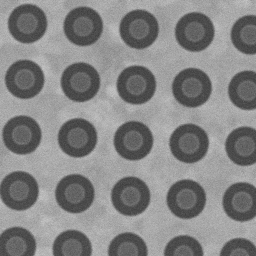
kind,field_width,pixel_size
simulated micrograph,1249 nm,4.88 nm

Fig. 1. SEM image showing an array of small figures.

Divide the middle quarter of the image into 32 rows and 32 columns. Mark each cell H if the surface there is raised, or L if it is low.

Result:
HLLLLLLHHHHHHHHHLLLLHHHHHHHHHHHH
LLLLLLLLHHHHHHHLLLLLLHHHHHHHHHLL
LLLHHLLLLHHHHHLLLLLLLLHHHHHHLLLL
LLHHHHLLLHHHHLLLHHHHLLLHHHHHLLLL
LLHHHHHLLHHHHLLLHHHHLLLHHHHLLLHH
LLHHHHLLLHHHHLLLHHHHLLLHHHHLLLHH
LLLHHHLLLHHHHLLLHHHHLLLHHHHLLLHH
LLLLLLLLHHHHHHLLLLLLLLLHHHHLLLHH
HLLLLLLHHHHHHHLLLLLLLLHHHHHHLLLL
HHHLLHHHHHHHHHHLLLLLLHHHHHHHLLLL
HHHHHHHHHHHHHHHHHHHHHHHHHHHHHHLL
HHHHHHHHHHHHHHHHHHHHHHHHHHHHHHHH
HHHHHHHHHHHHHHHHHHHHHHHHHHHHHHHH
HHHLHHHHHHHHHHHHHHHHHHHHHHHHHHHH
LLLLLLLHHHHHHHHHLLLHHHHHHHHHHHHH
LLLLLLLHHHHHHHLLLLLLLHHHHHHHHLLL
LLHHHLLLHHHHHLLLLLLLLLHHHHHHLLLL
LHHHHHLLHHHHHLLLHHHLLLHHHHHLLLLL
LHHHHHLLHHHHLLLHHHHLLLHHHHLLLHHH
LHHHHHLLHHHHLLLHHHHLLLLHHHLLLHHH
LLHHHLLLHHHHLLLHHHHLLLHHHHLLLHHH
LLLLLLLHHHHHHLLLLLLLLLHHHHLLLHHH
LLLLLLLHHHHHHLLLLLLLLHHHHHHLLLLL
HHHLHHHHHHHHHHHLLLLLHHHHHHHHLLLL
HHHHHHHHHHHHHHHHHHHHHHHHHHHHHLLL
HHHHHHHHHHHHHHHHHHHHHHHHHHHHHHHH
HHHHHHHHHHHHHHHHHHHHHHHHHHHHHHHH
HHLLHHHHHHHHHHHHHHHHHHHHHHHHHHHH
LLLLLLHHHHHHHHLLLLLHHHHHHHHHHHHH
LLLLLLLHHHHHHLLLLLLLHHHHHHHHLLLL
LHHHLLLHHHHHLLLLLLLLLHHHHHHLLLLL
HHHHHLLLHHHHLLLHHHLLLHHHHHLLLLLL